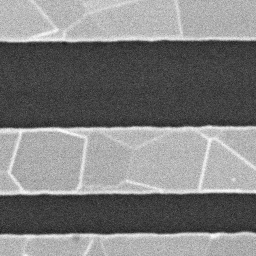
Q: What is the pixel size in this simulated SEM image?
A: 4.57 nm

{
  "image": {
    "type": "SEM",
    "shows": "wiring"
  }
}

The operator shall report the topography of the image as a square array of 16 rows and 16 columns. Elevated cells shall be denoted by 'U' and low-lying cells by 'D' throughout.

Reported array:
UUUUUUUUUUUUUUUU
UUUUUUUUUUUUUUUU
UUUUUUUUDUDDDDDD
DDDDDDDDDDDDDDDD
DDDDDDDDDDDDDDDD
DDDDDDDDDDDDDDDD
DDDDDDDDDDDDDDDD
DDDDDDDDDDDDDDDD
UUUUUUUUUUUUUUUU
UUUUUUUUUUUUUUUU
UUUUUUUUUUUUUUUU
UUUUUUUUUUUUUUUU
DDDDDDDDDDDDDDDD
DDDDDDDDDDDDDDDD
DDDDDDDDDDDDDDDD
UUUUUUUUUUUUUUUU